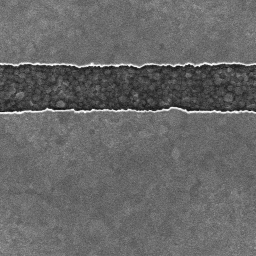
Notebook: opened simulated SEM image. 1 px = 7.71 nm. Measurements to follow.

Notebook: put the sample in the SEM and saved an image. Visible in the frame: one or a few lines or trenches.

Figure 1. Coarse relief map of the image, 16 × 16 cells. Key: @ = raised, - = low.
@@@@@@@@@@@@@@@@
@@@@@@@@@@@@@@@@
@@@@@@@@@@@@@@@@
@@@@@@@@@@@@@@@@
----------------
----------------
----------------
@@@@@@@@@@@@@@@@
@@@@@@@@@@@@@@@@
@@@@@@@@@@@@@@@@
@@@@@@@@@@@@@@@@
@@@@@@@@@@@@@@@@
@@@@@@@@@@@@@@@@
@@@@@@@@@@@@@@@@
@@@@@@@@@@@@@@@@
@@@@@@@@@@@@@@@@